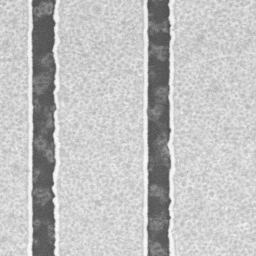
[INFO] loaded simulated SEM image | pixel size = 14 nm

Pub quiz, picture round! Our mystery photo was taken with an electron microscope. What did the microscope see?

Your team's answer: one or a few lines or trenches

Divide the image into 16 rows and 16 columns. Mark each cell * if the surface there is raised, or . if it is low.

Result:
**..*****..*****
**..*****..*****
**..*****..*****
**.******..*****
**..*****..*****
**..*****..*****
**..*****..*****
**..*****..*****
**..*****..*****
**..*****..*****
**..*****..*****
**.******..*****
**..*****..*****
**..*****..*****
**..*****..*****
**..*****..*****